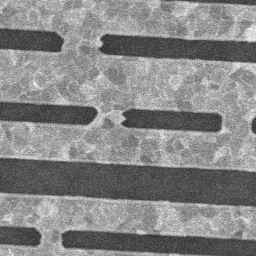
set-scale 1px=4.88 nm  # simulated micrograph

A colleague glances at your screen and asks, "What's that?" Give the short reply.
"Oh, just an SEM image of one or a few lines or trenches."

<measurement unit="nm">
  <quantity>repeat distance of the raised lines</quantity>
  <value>327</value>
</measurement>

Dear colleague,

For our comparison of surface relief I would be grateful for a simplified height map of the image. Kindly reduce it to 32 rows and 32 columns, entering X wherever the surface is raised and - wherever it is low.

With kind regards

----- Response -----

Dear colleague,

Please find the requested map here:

XXXXXXXXXXXXXXXXXXXXXXXXX-------
XXXXXXXXXXXXXXXXXXXXXXXXXXXXXXXX
XXXXXXXXXXXXXXXXXXXXXXXXXXXXXXXX
-----XXXXXXXXXXXXXXXXXXXXXXXXXXX
--------XXXXX--------XXXXXXXXXXX
--------XXXX--------------------
XX------XXXX--------------------
XXXXXXXXXXXXXXXXXXXX------------
XXXXXXXXXXXXXXXXXXXXXXXXXXXXXXXX
XXXXXXXXXXXXXXXXXXXXXXXXXXXXXXXX
XXXXXXXXXXXXXXXXXXXXXXXXXXXXXXXX
XXXXXXXXXXXXXXXXXXXXXXXXXXXXXXXX
--XXXXXXXXXXXXXXXXXXXXXXXXXXXXXX
------------XXXX--XXXXXXXXXXXXXX
------------XXX-------------XXXX
XX---------XXXX-------------XXX-
XXXXXXXXXXXXXXXXXXXXXX------XXX-
XXXXXXXXXXXXXXXXXXXXXXXXXXXXXXXX
XXXXXXXXXXXXXXXXXXXXXXXXXXXXXXXX
XXXXXXXXXXXXXXXXXXXXXXXXXXXXXXXX
------------------XXXXXXXXXXXXXX
--------------------------------
--------------------------------
--------------------------------
XXX-----------------------------
XXXXXXXXXXXXXXXXXXXXX-----------
XXXXXXXXXXXXXXXXXXXXXXXXXXXXXXXX
XXXXXXXXXXXXXXXXXXXXXXXXXXXXXXXX
-----XXXXXXXXXXXXXXXXXXXXXXXXXXX
-----XXX-------------------XXXXX
-----XXX------------------------
XXXXXXXXXXXX--------------------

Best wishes